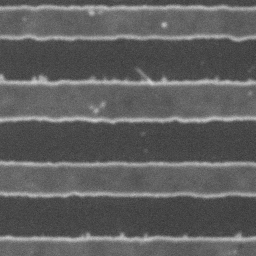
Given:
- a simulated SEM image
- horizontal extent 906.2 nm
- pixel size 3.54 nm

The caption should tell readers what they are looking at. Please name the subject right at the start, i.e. lines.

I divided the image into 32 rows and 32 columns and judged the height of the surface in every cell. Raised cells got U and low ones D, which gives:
DDDDDDDDDDDDDDDDDDDDDDDDDDDDDDDD
UUUUUUUUUUUUUUUUUUUUUUUUUUUUUUUU
UUUUUUUUUUUUUUUUUUUUUUUUUUUUUUUU
UUUUUUUUUUUUUUUUUUUUUUUUUUUUUUUU
UUUUUUUUUUUUUUUUUUUUUUUUUUUUUUUU
DDDDDDDDDDDDDDDDDDDDDDDDDDDDDDDD
DDDDDDDDDDDDDDDDDDDDDDDDDDDDDDDD
DDDDDDDDDDDDDDDDDDDDDDDDDDDDDDDD
DDDDDDDDDDDDDDDDDDDDDDDDDDDDDDDD
DDDDDDDDDDDDDDDDDDDDDDDDDDDDDDDD
UUUUUUUUUUUUUUUUUUUUUUUUUUUUUUUU
UUUUUUUUUUUUUUUUUUUUUUUUUUUUUUUU
UUUUUUUUUUUUUUUUUUUUUUUUUUUUUUUU
UUUUUUUUUUUUUUUUUUUUUUUUUUUUUUUU
UUUUUUUUUUUUUUUUUUUUUUUUUUUUUUUU
DDDDDDDDDDDDDDDDDDDDDDDDDDDDDDDD
DDDDDDDDDDDDDDDDDDDDDDDDDDDDDDDD
DDDDDDDDDDDDDDDDDDDDDDDDDDDDDDDD
DDDDDDDDDDDDDDDDDDDDDDDDDDDDDDDD
DDDDDDDDDDDDDDDDDDDDDDDDDDDDDDDD
UUUUUUUUUUUUUUUUUUUUUUUUUUUUUUUU
UUUUUUUUUUUUUUUUUUUUUUUUUUUUUUUU
UUUUUUUUUUUUUUUUUUUUUUUUUUUUUUUU
UUUUUUUUUUUUUUUUUUUUUUUUUUUUUUUU
DDDDUUUUDDDDDDDDUDDUUDDDUUUUDDDD
DDDDDDDDDDDDDDDDDDDDDDDDDDDDDDDD
DDDDDDDDDDDDDDDDDDDDDDDDDDDDDDDD
DDDDDDDDDDDDDDDDDDDDDDDDDDDDDDDD
DDDDDDDDDDDDDDDDDDDDDDDDDDDDDDDD
DDDDDDDDDDDDDDDDDDDDDDDDDDDDDDDD
UUUUUUUUUUUUUUUUUUUUUUUUUUUUUUUU
UUUUUUUUUUUUUUUUUUUUUUUUUUUUUUUU